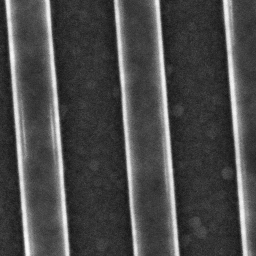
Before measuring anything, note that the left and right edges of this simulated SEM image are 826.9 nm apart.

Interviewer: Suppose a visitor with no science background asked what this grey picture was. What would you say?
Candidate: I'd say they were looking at one or a few lines or trenches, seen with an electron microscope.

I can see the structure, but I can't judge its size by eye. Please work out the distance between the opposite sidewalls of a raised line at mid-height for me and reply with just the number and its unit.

133 nm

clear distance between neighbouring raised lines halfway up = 217 nm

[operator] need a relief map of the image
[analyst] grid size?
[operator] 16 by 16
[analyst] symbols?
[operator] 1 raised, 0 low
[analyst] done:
0110000111000011
0110000111000011
0110000111000011
0110000011000011
0110000011000011
0110000011000011
0111000011000001
0111000011000001
0111000011100001
0111000011100001
0111000011100001
0111000011100001
0111000011100001
0011000011100001
0011000011100001
0011000011100001